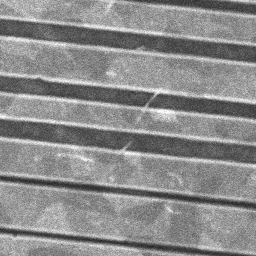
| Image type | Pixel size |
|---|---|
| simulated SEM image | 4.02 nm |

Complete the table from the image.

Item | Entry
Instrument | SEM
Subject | parallel lines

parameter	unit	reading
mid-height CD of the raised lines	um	0.14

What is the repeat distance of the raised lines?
200 nanometers